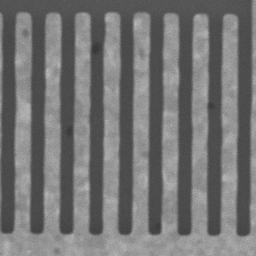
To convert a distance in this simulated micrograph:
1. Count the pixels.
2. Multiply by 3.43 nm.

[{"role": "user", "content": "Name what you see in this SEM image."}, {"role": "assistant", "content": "groups of lines, slits or small figures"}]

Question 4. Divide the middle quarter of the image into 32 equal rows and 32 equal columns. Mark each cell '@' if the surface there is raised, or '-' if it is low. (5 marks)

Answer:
---@@@----@@@@---@@@@----@@@----
---@@@----@@@@---@@@@----@@@@---
---@@@----@@@@----@@@----@@@@---
---@@@----@@@@----@@@----@@@@---
---@@@----@@@@----@@@----@@@@---
---@@@----@@@@----@@@----@@@@---
---@@@----@@@@----@@@----@@@----
---@@@----@@@@---@@@@----@@@----
---@@@----@@@@---@@@@----@@@----
---@@@----@@@@---@@@@----@@@----
---@@@----@@@@---@@@@----@@@----
---@@@----@@@@---@@@@----@@@----
---@@@----@@@@---@@@@----@@@----
---@@@----@@@@---@@@@----@@@----
---@@@----@@@@---@@@@----@@@----
---@@@----@@@@---@@@@----@@@----
---@@@----@@@@---@@@@----@@@----
---@@@----@@@@---@@@@----@@@----
---@@@----@@@@---@@@@----@@@----
---@@@----@@@@---@@@@----@@@----
---@@@----@@@@---@@@@----@@@----
---@@@----@@@@---@@@@----@@@----
---@@@----@@@----@@@@----@@@----
---@@@----@@@@---@@@@----@@@----
---@@@----@@@@---@@@@----@@@----
---@@@----@@@@---@@@@----@@@----
---@@@----@@@@---@@@@----@@@----
---@@@----@@@----@@@@----@@@----
---@@@----@@@----@@@@----@@@----
---@@@----@@@----@@@@----@@@----
---@@@----@@@----@@@@----@@@----
---@@@----@@@----@@@@----@@@----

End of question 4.